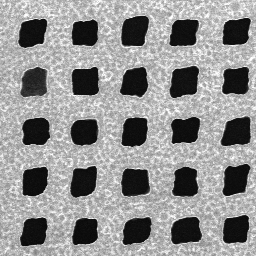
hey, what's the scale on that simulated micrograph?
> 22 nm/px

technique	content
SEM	a regular array of holes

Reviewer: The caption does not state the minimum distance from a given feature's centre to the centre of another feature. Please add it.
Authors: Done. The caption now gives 1070 nanometres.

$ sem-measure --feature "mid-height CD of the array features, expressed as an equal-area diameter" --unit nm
637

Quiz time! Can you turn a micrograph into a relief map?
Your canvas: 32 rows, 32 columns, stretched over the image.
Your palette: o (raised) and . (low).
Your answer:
oooooooooooooooooooooooooooooooo
oooooooooooooooooooooooooooooooo
oooo..oooooooooo...ooo..ooooo..o
ooo...ooo...ooo....ooo...ooo...o
oo....ooo...ooo...ooo....ooo...o
oo...oooo...ooo...ooo...oooo..oo
oooooooooooooooooooooooooooooooo
oooooooooooooooooooooooooooooooo
oooo.oooooooooooo.ooooo..ooooo.o
ooo...ooo...ooo...ooo....ooo...o
ooo...ooo...ooo...ooo....ooo...o
ooo...ooo...ooo...ooo...oooo...o
oooooooooooooooooooooooooooooooo
oooooooooooooooooooooooooooooooo
oooooooooooooooooooooooooooooooo
ooo...ooo...ooo...ooo....ooo...o
ooo...ooo...ooo...ooo....ooo...o
ooo...ooo...ooo...ooo....ooo...o
oooooooooooooooooooooooooooooooo
oooooooooooooooooooooooooooooooo
oooooooooooooooooooooooooooooooo
ooo...ooo...oooo..oooo..oooo...o
ooo...ooo...ooo....ooo..oooo...o
ooo...ooo...ooo....ooo...ooo...o
ooooooooo..ooooo.ooooo..oooooooo
oooooooooooooooooooooooooooooooo
oooooooooooooooooooooooooooooooo
ooo...oooo..oooo...ooo...ooo...o
ooo...ooo...ooo....oo....ooo...o
ooo...ooo...ooo....oo....ooo...o
ooo..oooo..ooooooooooooooooooooo
oooooooooooooooooooooooooooooooo